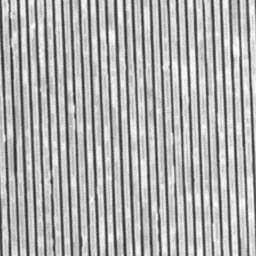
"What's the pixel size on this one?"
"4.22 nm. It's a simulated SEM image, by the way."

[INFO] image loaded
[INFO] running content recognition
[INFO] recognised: parallel lines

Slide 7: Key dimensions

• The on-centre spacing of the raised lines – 8.82 pixels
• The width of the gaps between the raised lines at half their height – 15.8 nanometres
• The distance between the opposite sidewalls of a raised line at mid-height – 23.7 nanometers